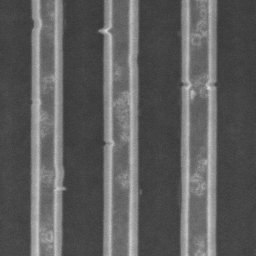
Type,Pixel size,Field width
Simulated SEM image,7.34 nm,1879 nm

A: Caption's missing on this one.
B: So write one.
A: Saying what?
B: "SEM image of one or a few lines or trenches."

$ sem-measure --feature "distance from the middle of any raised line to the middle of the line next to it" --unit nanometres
556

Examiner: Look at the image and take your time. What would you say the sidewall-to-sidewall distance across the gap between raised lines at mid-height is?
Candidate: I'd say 367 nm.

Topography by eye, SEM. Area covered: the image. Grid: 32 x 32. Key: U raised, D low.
DDDDDUUDDDDDDDUUUDDDDDDUUUUDDDDD
DDDDDUUDDDDDDDUUUDDDDDDUUUUDDDDD
DDDDDUUDDDDDDDUUUDDDDDDUUUUDDDDD
DDDDDUUDDDDDDUUUUDDDDDDUUUUDDDDD
DDDDDUUDDDDDDUUUUDDDDDDUUUUDDDDD
DDDDDUUDDDDDDDUUUDDDDDDUUUUDDDDD
DDDDDUUDDDDDDDUUUDDDDDDUUUUDDDDD
DDDDUUUDDDDDDDUUUDDDDDDUUUUDDDDD
DDDDDUUDDDDDDDUUUDDDDDDUUUUDDDDD
DDDDDUUDDDDDDDUUUDDDDDDUUUUDDDDD
DDDDDUUDDDDDDDUUUDDDDDDUUUDDDDDD
DDDDDUUDDDDDDUUUUDDDDDDUUUUDDDDD
DDDDDUUDDDDDDUUUUDDDDDDUUUUDDDDD
DDDDDUUDDDDDDUUUUDDDDDDUUUUDDDDD
DDDDDUUDDDDDDUUUUDDDDDDUUUUDDDDD
DDDDUUUDDDDDDUUUUDDDDDDUUUUDDDDD
DDDDUUUDDDDDDUUUUDDDDDDUUUUDDDDD
DDDDUUUDDDDDDUUUUDDDDDDUUUUDDDDD
DDDDUUUDDDDDDDUUUDDDDDDUUUUDDDDD
DDDDUUUDDDDDDDUUUDDDDDDUUUDDDDDD
DDDDUUUDDDDDDDUUUDDDDDDUUUDDDDDD
DDDDUUUDDDDDDDUUUDDDDDDUUUDDDDDD
DDDDUUUDDDDDDDUUUDDDDDDUUUDDDDDD
DDDDUUUDDDDDDDUUUDDDDDDUUUDDDDDD
DDDDUUUDDDDDDDUUUDDDDDDUUUDDDDDD
DDDDUUUDDDDDDDUUUDDDDDDUUUDDDDDD
DDDDUUUDDDDDDDUUUDDDDDDUUUDDDDDD
DDDDUUUDDDDDDDUUUDDDDDDUUUDDDDDD
DDDDUUUDDDDDDUUUUDDDDDDUUUDDDDDD
DDDDUUUDDDDDDUUUUDDDDDDUUUDDDDDD
DDDDUUUDDDDDDUUUUDDDDDDUUUDDDDDD
DDDDUUUDDDDDDUUUUDDDDDDUUUDDDDDD